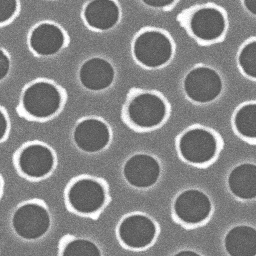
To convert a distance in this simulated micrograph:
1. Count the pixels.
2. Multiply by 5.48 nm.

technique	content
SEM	a regular array of holes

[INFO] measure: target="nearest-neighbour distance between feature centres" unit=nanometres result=332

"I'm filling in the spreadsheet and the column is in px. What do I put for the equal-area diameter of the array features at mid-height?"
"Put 34.7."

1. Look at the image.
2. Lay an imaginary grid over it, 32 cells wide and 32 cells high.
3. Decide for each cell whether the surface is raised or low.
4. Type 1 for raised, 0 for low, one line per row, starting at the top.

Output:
00111111111000111100011111111110
00111111111000011111111110011110
01111111111000011111111100001111
11111001111100111111111100001111
11110000111111111000011110011111
11110000111111111000011111111110
11111001111111111000011111111100
01111111111001111000011111111100
01111111110000111111111110111100
01111111110000111111111000011110
11110011110000111111111000001111
11100001111111111111111000001111
11100001111111111000111100011111
11100001111111110000011111111100
01110011111111110000011111111000
01111111110001111000111111111000
01111111100000111111111000111100
11111111100000111111111000011111
11100011110001111111110000011111
11100001111111111001111000011111
11000001111111110000111111111101
11100011111111100000111111111000
11111111110111110000111111111000
11111111100001111111111111111000
11111111100001111111110000111100
11111111100001111111110000111111
11000011110011111111110000111111
11000011111111110001111001111111
11000011111111100001111111111000
11100111111111100001111111110000
11111111100011110001111111110000
11111111000011111111111011110000